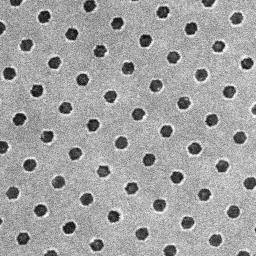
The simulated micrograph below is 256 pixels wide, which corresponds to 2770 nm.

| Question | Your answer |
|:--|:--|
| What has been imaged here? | a regular array of holes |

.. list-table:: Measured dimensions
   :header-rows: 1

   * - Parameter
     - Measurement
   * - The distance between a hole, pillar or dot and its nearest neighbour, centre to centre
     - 0.355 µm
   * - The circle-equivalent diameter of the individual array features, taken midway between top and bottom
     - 0.147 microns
